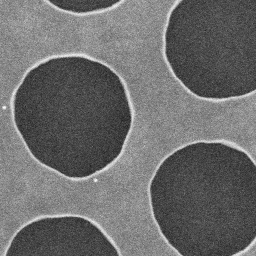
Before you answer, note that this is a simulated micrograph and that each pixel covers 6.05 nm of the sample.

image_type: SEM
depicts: holes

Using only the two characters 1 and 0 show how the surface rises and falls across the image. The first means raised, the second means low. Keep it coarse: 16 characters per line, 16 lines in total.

1111000111100000
1111111111000000
1111111111000000
1111111111000000
1100000111100000
1000000011110000
1000000011111111
1000000011111111
1000000011111111
1100000011100001
1110001111000000
1111111110000000
1111111110000000
1111111111000000
1000001111000000
1000000111100001